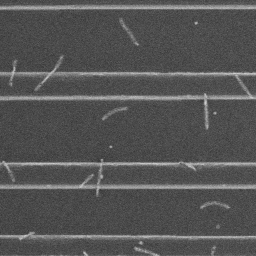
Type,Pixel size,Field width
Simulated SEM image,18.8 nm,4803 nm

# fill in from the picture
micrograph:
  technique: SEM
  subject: lines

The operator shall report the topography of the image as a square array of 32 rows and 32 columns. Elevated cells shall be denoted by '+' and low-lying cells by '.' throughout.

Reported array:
++++++++++++++++++++++++++++++++
................................
................................
................................
................................
................................
................................
................................
................................
++++++++++++++++++++++++++++++++
++++++++++++++++++++++++++++++++
++++++++++++++++++++++++++++++++
................................
................................
................................
................................
................................
................................
................................
................................
+...........+.........+.........
++++++++++++++++++++++++++++++++
++++++++++++++++++++++++++++++++
................................
................................
................................
................................
................................
................................
...+............................
++++++++++++++++++++++++++++++++
++++++++++++++++++++++++++++++++